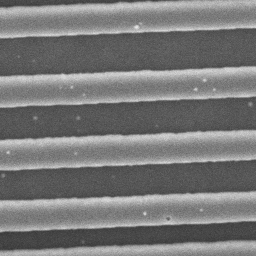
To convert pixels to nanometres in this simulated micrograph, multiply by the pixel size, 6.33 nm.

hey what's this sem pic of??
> lines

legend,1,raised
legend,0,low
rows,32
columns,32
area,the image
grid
00000000000000111111111111111111
11111111111111111111111111111111
11111111111111111111111111111111
11111111111111111111111111111100
11100000000000000000000000000000
00000000000000000000000000000000
00000000000000000000000000000000
00000000000000000000000000000000
00000000000000000000000000000011
00001111111111111111111111111111
11111111111111111111111111111111
11111111111111111111111111111111
11111111111111111111000000000000
00000000000000000000000000000000
00000000000000000000000000000000
00000000000000000000000000000000
00000000000000000000000000000111
00011111111111111111111111111111
11111111111111111111111111111111
11111111111111111111111111111111
11111111111111111110000000000000
00000000000000000000000000000000
00000000000000000000000000000000
00000000000000000000000000000000
00000000000000000000011111111111
11111111111111111111111111111111
11111111111111111111111111111111
11111111111111111111111111111111
11111111111110000000000000000000
00000000000000000000000000000000
00000000000000000000000111111111
11111111111111111111111111111111